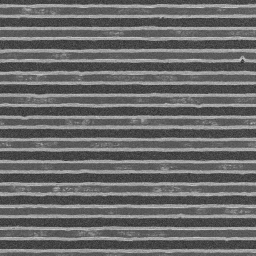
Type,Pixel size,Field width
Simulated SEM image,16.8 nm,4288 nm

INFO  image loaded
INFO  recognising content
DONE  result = parallel lines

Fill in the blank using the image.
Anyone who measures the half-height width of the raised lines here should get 170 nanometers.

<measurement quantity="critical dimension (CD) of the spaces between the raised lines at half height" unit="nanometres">199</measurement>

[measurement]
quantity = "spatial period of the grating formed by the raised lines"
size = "373 nm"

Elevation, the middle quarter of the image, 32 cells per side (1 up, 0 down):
00000000000000000000000000000000
00000000000000000000000000000000
11111111111111111111111111111111
11111111111111111111111111111111
11111111111111111111111111111111
00000000000000000000000000000000
00000000000000000000000000000000
00000000000000000000000000000000
11111111111111111111111111111111
11111111111111111111111111111111
00000000000000000000000000000000
00000000000000000000000000000000
00000000000000000000000000000000
11111111111111111111111111111111
11111111111111111111111111111111
11111111111111111111111111111111
00000000000000000000000000000000
00000000000000000000000000000000
00000000000000000000000000000000
11111111111111111111111111111111
11111111111111111111111111111111
00000000000000000000000000000000
00000000000000000000000000000000
00000000000000000000000000000000
00000000000000010000000011100000
11111111111111111111111111111111
11111111111111111111111111111111
00000000000000000000000000000000
00000000000000000000000000000000
00000000000000000000000000000000
11111111111111111111111111111111
11111111111111111111111111111111